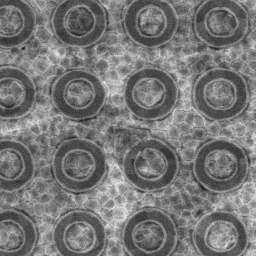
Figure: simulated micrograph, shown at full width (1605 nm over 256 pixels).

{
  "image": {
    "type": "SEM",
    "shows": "ring-shaped raised bodies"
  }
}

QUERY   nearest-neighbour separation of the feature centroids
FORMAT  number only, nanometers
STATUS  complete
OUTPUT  418